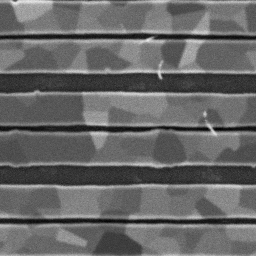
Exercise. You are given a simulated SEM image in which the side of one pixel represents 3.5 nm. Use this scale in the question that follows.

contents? parallel lines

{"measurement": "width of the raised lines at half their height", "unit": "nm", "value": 112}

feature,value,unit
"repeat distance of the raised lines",46.1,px